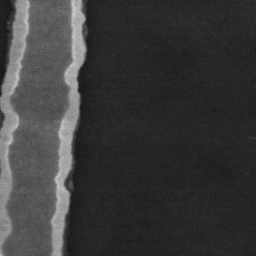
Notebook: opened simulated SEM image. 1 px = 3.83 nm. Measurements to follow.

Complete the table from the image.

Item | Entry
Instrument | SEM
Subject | one or a few lines or trenches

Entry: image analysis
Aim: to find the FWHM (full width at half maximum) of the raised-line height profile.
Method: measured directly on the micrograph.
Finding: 236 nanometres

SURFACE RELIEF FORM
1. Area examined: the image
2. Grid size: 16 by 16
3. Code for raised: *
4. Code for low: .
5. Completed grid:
.****...........
.****...........
.****...........
.****...........
.****...........
*****...........
*****...........
.***............
****............
****............
****............
****............
****............
****............
****............
****............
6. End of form